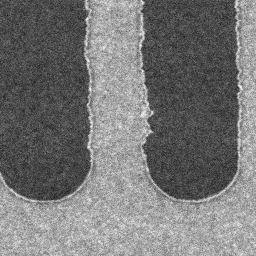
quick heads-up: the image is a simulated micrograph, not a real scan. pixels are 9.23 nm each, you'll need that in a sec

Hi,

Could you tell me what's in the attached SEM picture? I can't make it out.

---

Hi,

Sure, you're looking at one or a few lines or trenches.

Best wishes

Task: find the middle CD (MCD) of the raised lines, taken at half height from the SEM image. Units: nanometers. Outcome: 870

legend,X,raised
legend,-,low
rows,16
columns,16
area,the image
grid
XXXXXX---XXXXXX-
XXXXX----XXXXXX-
XXXXX----XXXXXX-
XXXXX----XXXXXX-
XXXXXX---XXXXXX-
XXXXXX---XXXXXX-
XXXXXX---XXXXXX-
XXXXXX---XXXXXX-
XXXXXX---XXXXXX-
XXXXXX---XXXXXX-
XXXXXX---XXXXXX-
XXXXX-----XXXX--
--XX-------XX---
----------------
----------------
----------------